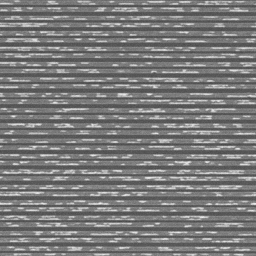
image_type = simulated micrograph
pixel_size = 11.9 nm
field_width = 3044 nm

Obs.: parallel lines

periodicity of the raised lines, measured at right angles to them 91.3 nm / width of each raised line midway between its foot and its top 44.6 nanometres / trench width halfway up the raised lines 38.6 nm